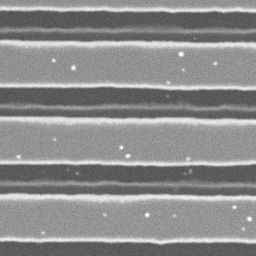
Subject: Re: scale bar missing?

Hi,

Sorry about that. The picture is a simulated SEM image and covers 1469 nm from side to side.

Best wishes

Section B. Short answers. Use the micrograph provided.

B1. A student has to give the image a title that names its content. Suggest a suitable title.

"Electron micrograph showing lines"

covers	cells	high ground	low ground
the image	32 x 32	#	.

################################
.....................#..........
................................
................................
................................
################################
################################
################################
################################
################################
################################
................................
................................
................................
................................
################################
################################
################################
################################
################################
...............################.
................................
................................
................................
#########################.......
################################
################################
################################
################################
################################
................................
................................